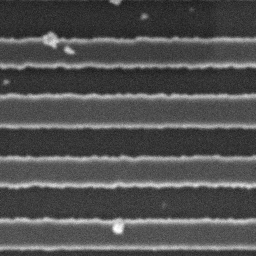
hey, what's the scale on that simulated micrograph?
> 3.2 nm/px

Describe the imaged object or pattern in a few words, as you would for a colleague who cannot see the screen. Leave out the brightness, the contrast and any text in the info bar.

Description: lines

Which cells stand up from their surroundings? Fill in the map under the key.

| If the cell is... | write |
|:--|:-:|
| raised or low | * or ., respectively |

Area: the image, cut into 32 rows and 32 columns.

................................
................................
................................
................................
......*.........................
********************************
********************************
********************************
*.*.....**...*.........*.*......
................................
................................
................................
********************************
********************************
********************************
********************************
................................
................................
................................
........................*.*.....
********************************
********************************
********************************
................................
................................
................................
................................
*******.*.....**.....*...****..*
********************************
********************************
********************************
................................